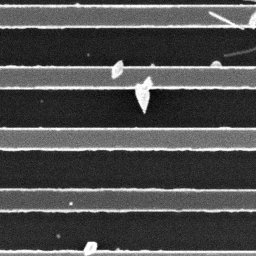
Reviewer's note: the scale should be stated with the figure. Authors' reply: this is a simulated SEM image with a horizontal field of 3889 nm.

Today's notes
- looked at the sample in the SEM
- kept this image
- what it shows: lines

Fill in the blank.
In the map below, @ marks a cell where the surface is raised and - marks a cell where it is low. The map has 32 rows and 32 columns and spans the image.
--------------------------------
@@@@@@@@@@@@@@@@@@@@@@@@@@@@@@@@
@@@@@@@@@@@@@@@@@@@@@@@@@@@@@@@@
-----@------------------------@@
--------------------------------
--------------------------------
--------------------------------
--------------------------------
@@@@@@@@@@@@@@@@@@@@@@@@@@@@@@@@
@@@@@@@@@@@@@@@@@@@@@@@@@@@@@@@@
@@@@@@@@@@@@@@@@@@@@@@@@@@@@@@@@
-----------------@@-------------
-----------------@@-------------
--------------------------------
--------------------------------
--------------------------------
@@@@@@@@@@@@@@@@@@@@@@@@@@@@@@@@
@@@@@@@@@@@@@@@@@@@@@@@@@@@@@@@@
@@@@@@@@@@@@@@@@@@@@@@@@@@@@@@@@
--------------------------------
--------------------------------
--------------------------------
--------------------------------
--------------------------------
@@@@@@@@@@@@@@@@@@@@@@@@@@@@@@@@
@@@@@@@@@@@@@@@@@@@@@@@@@@@@@@@@
--------------------------------
--------------------------------
--------------------------------
--------------------------------
-----------@--------------------
@@@@@@@@@@@@@@@@@@@@@@@@@@@@@@@@